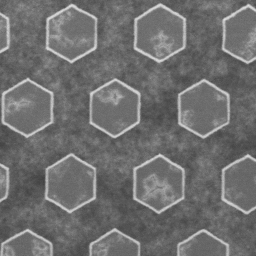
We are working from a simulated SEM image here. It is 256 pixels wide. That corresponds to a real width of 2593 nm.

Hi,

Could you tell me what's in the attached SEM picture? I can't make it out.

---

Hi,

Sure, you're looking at raised bodies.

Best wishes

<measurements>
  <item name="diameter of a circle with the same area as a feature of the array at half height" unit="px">52.3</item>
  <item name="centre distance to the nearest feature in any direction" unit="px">86.8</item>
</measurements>